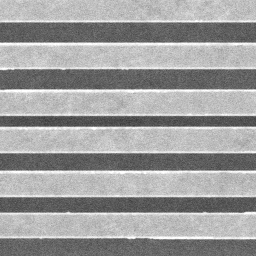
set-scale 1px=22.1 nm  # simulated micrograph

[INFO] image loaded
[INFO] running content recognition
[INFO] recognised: lines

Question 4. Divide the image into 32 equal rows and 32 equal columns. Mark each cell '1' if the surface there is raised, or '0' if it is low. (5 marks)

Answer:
11111111111111111111111111111111
11111111111111111111111111111111
11111111111111111111111111111111
00000000000000000000000000000000
00000000000000000000000000000000
11111111111111111111111111111111
11111111111111111111111111111111
11111111111111111111111111111111
11111111111111111111111111111111
00000000000000000000000000000000
00000000000000000000000000000000
11111111111111111111111111111111
11111111111111111111111111111111
11111111111111111111111111111111
00000000000000000000000000000000
00000000000000000000000000000000
11111111111111111111111111111111
11111111111111111111111111111111
11111111111111111111111111111111
00000000000000000000000000000000
00000000000000000000000000000000
11111111111111111111111111111111
11111111111111111111111111111111
11111111111111111111111111111111
11111111111111111111111111111111
00000000000000000000000000000000
00000000000000000000000000000000
11111111111111111111111111111111
11111111111111111111111111111111
11111111111111111111111111111111
00000000000000000000000000000000
00000000000000000000000000000000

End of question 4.